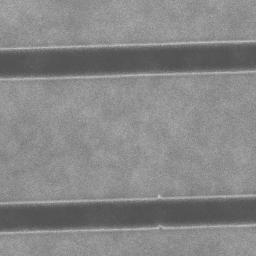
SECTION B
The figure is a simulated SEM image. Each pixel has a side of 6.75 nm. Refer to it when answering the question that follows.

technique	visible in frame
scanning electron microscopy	one or a few lines or trenches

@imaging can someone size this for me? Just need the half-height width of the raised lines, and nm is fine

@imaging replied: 208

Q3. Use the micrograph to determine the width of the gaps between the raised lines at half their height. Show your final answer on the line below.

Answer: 830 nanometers